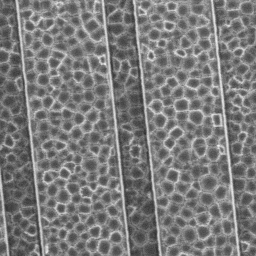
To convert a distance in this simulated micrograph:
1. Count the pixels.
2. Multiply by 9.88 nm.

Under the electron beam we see one or a few lines or trenches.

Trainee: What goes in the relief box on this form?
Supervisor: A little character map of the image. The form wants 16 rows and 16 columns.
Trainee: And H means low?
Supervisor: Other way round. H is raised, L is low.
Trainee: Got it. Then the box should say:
LHHHHHLLHHHHHLLL
LHHHHHHLLHHHHLLL
LHHHHHHLLHHHHHLL
LHHHHHHLLHHHHHLL
LHHHHHHLLHHHHHLL
LLHHHHHLLHHHHHLL
LLHHHHHLLHHHHHLL
LLHHHHHLLHHHHHLL
LLHHHHHLLHHHHHLL
LLHHHHHLLHHHHHLL
LLHHHHHHLHHHHHLL
LLHHHHHHLLHHHHLL
LLHHHHHHLLHHHHHL
LLHHHHHHLLHHHHHL
LLLHHHHHLLHHHHHL
LLLHHHHHLLHHHHHL